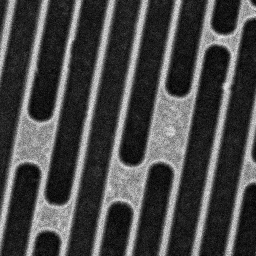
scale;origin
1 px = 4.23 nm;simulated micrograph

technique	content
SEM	parallel lines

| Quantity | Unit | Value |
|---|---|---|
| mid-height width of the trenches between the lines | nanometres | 104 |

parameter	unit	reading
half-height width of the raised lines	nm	34.3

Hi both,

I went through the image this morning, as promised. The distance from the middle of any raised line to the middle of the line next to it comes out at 138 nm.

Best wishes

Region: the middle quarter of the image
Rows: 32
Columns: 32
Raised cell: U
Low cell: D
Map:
UDDDDDDDUUDDDDDDUUDDDDDDUUDDDDDD
UDDDDDDDUUDDDDDDUUDDDDDDUUDDDDDD
UDDDDDDDUDDDDDDDUUDDDDDDUUDDDDDD
UDDDDDDUUDDDDDDUUDDDDDDDUUDDDDDD
UDDDDDDUUDDDDDDUUDDDDDDDUUDDDDDD
UDDDDDDUUDDDDDDUUDDDDDDDUDDDDDDD
DDDDDDDUDDDDDDDUUDDDDDDUUUDDDDDU
DDDDDDDUDDDDDDDUUDDDDDDUUUDDDDDU
DDDDDDUUDDDDDDDUDDDDDDDUUUUUUUUU
DDDDDDUUDDDDDDUUDDDDDDDUUUUUUUUU
DDDDDDUUDDDDDDUUDDDDDDDUUUUUUUUU
DDDDDDUDDDDDDDUUDDDDDDUUUUUUUUUU
DDDDDDUDDDDDDDUUDDDDDDUUUUUUUUUU
DDDDDUUDDDDDDDUDDDDDDDUUUUUUUUUU
DDDDDUUDDDDDDUUDDDDDDDUUUUUUUUUU
DDDDDUUDDDDDDUUDDDDDDDUUUUUUUUUU
DDDDDUUDDDDDDUUDDDDDDUUUUUUUUUUD
DDDDDUDDDDDDDUUDDDDDDUUUUUUUUUUD
DDDDUUDDDDDDDUDDDDDDDUUUUUUUUUUD
DDDDUUDDDDDDDUDDDDDDDUUUUUUUUUUD
DDDDUUDDDDDDUUDDDDDDDUUUUUUUUUUD
DDDDUUDDDDDDUUDDDDDDUUUUUUUUUUUD
DDDDUUDDDDDDUUDDDDDDUUUUUUUUUUDD
DDDUUDDDDDDDUUDDDDDDUUUUUUUUUUDD
DDDUUDDDDDDDUUUDDDDUUUUUUUUUUUDD
DDDUUDDDDDDUUUUUUDUUUUDDDDUUUUDD
DDDUUDDDDDDUUUUUUUUUUDDDDDDUUUDD
DDDUUDDDDDDUUUUUUUUUUDDDDDDUUDDD
DDUUDDDDDDDUUUUUUUUUUDDDDDDUUDDD
DDUUDDDDDDUUUUUUUUUUUDDDDDDUUDDD
DDUUDDDDDDUUUUUUUUUUDDDDDDDUUDDD
DDUUDDDDDDUUUUUUUUUUDDDDDDDUUDDD